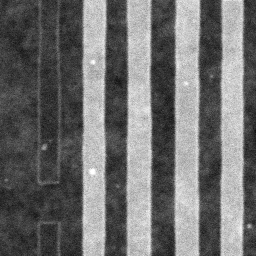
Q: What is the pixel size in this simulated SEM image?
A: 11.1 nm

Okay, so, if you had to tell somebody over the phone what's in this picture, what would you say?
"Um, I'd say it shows wiring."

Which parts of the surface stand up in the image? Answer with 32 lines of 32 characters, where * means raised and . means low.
.....**....**...***...***...**..
.....**....**...***...***...**..
.....**....**...***...***...**..
.....**....**...***...***...**..
.....**....**...***...***...**..
.....**....**...***...***...**..
.....**....**...***...***...**..
.....**...***...***...***...**..
.....**...***...***...***...**..
.....**....**...***...***...**..
.....**....**...***...***...**..
.....**....**...***...***...**..
.....**....**...***...***...**..
.....**....**...***...***...**..
.....**....**...***...***...**..
.....**....**...***...***...**..
.....**....**...***...***...**..
.....**...***...***...***...**..
.....**...***...***...***...**..
.....**...***...***...***...**..
.....**....**...***...***...**..
.....**....**...***...***...**..
.....**....**...***...***...**..
...........**...***...***...**..
...........**...***...***...**..
...........**...***...***...**..
..........***...***...***...**..
..........***...***...***...**..
.....**...***...***...***...**..
.....**...***...***...***...**..
.....**...***...***...***...**..
.....**...***...***...***...**..